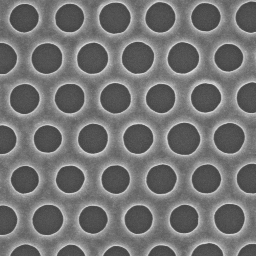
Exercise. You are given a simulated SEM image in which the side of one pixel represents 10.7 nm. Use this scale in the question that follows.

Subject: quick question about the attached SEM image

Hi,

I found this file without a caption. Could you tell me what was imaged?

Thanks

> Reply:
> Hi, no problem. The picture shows a regular array of holes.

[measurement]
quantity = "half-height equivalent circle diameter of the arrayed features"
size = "320 nm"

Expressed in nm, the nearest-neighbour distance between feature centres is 483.